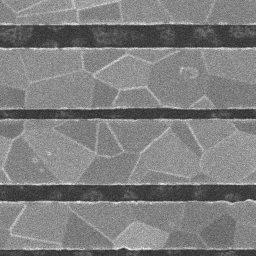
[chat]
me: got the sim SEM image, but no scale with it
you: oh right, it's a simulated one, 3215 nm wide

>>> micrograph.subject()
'one or a few lines or trenches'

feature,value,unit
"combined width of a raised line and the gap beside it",924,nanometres